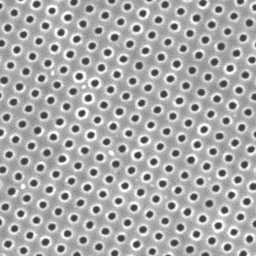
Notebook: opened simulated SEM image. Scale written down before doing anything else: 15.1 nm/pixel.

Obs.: a regular array of holes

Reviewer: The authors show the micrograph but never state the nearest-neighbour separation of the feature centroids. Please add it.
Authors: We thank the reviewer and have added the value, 248 nm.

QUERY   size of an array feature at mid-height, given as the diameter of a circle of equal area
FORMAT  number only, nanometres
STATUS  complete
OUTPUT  120